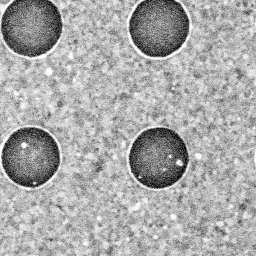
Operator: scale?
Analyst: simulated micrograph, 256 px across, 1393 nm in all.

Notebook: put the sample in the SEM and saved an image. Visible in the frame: holes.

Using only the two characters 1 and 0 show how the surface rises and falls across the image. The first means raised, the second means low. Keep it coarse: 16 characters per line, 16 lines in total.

0000111100001111
0000111100001111
0000111100001111
1001111110011111
1111111111111111
1111111111111111
1111111111111111
1111111111111111
1001111110011111
0000111100001111
0000111100001111
1001111110011111
1111111111111111
1111111111111111
1111111111111111
1111111111111111